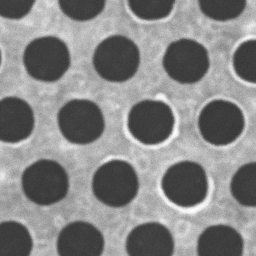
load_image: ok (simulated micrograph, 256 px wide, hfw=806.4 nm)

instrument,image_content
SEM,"a regular array of holes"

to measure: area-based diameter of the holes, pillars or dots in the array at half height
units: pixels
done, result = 46.8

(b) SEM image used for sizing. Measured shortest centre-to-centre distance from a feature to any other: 220 nm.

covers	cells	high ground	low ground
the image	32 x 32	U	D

DDDDUUUDDDDDDUUUDDDDDDUUUDDDDDDU
DDDDUUUUDDDDDUUUUDDDDUUUUDDDDDUU
UUUUUUUUUDDUUUUUUUDUUUUUUUUDDUUU
UUUUUUUUUUUUUUUUUUUUUUUUUUUUUUUU
UUUUUUUUUUUUUUDDUUUUUUUUUUUUUUUU
UUUUDDDDUUUUDDDDDUUUUDDDDUUUUUDD
UUUDDDDDDUUUDDDDDUUUUDDDDDUUUDDD
UUUDDDDDDUUUDDDDDUUUDDDDDDUUUDDD
UUUDDDDDDUUUDDDDDUUUUDDDDDUUUDDD
UUUUDDDDUUUUUDDDDUUUUDDDDDUUUUDD
UUUUUUUUUUUUUUUUUUUUUUUUUUUUUUUU
UUUUUUUUUUUUUUUUUUUUUUUUUUUUUUUU
DDDUUUUUUDDUUUUUUUUUUUUUUUUDUUUU
DDDDUUUUDDDDUUUUDDDDDUUUUDDDDDUU
DDDDUUUDDDDDDUUUDDDDDDUUUDDDDDUU
DDDDUUUDDDDDDUUUDDDDDDUUUDDDDDDU
DDDDUUUUDDDDDUUUDDDDDDUUUDDDDDUU
DDDUUUUUDDDDUUUUUDDDDUUUUUDDDUUU
UUUUUUUUUUUUUUUUUUUUUUUUUUUUUUUU
UUUUUUUUUUUUUUUUUUUUUUUUUUUUUUUU
UUUUDDDUUUUUUDDDUUUUUUDDDUUUUUUD
UUUDDDDDUUUUDDDDDUUUUDDDDDUUUDDD
UUUDDDDDDUUUDDDDDUUUDDDDDDUUUDDD
UUUDDDDDDUUUDDDDDUUUDDDDDDUUUDDD
UUUDDDDDUUUUDDDDDUUUUDDDDDUUUDDD
UUUUUDDUUUUUUDDDUUUUUUDDDUUUUUDD
UUUUUUUUUUUUUUUUUUUUUUUUUUUUUUUU
UUUUUUUUUUUUUUUUUUUUUUUUUUUUUUUU
DDDUUUUUDDDDUUUUUDDDDUUUUUDDDUUU
DDDDUUUDDDDDDUUUDDDDDDUUUDDDDDUU
DDDDUUUDDDDDDUUUDDDDDDUUUDDDDDUU
DDDDUUUDDDDDDUUUDDDDDDUUUDDDDDUU